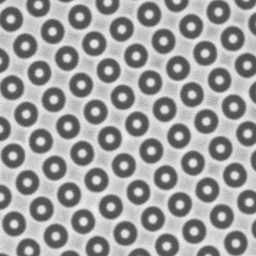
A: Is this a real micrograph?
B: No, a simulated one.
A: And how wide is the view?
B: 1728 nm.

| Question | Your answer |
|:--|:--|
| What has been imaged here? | a regular array of ring-shaped grooves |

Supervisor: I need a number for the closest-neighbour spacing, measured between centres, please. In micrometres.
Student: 0.204